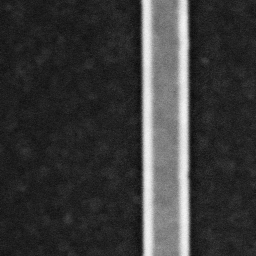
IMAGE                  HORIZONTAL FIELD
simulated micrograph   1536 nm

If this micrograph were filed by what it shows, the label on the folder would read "one or a few lines or trenches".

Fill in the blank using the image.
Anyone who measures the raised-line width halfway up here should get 230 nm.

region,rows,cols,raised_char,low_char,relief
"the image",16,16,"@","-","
---------@@-----
---------@@-----
---------@@@----
---------@@@----
---------@@@----
---------@@@----
---------@@@----
---------@@@----
---------@@@----
---------@@@----
---------@@@----
---------@@@----
---------@@@----
---------@@@----
---------@@@----
---------@@@----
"